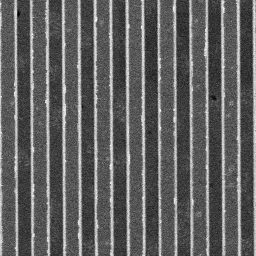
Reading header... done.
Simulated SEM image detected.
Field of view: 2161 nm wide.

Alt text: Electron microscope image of parallel lines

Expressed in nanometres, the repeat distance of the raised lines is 269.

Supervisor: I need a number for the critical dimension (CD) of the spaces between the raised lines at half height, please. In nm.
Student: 135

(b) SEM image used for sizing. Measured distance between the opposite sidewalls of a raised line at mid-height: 135 nanometers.